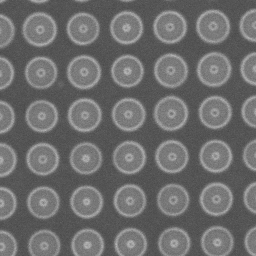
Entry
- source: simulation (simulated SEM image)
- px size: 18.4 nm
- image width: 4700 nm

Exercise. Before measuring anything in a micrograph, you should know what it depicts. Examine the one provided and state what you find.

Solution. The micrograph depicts an array of small figures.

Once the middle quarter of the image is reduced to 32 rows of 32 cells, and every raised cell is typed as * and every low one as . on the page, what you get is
**......*****......****.......**
*...**...***...*....***...*....*
*....*...***.......****.......**
**......*****......****.......**
**......******....******.....***
***...********************.*****
********************************
********************************
**************************.*****
****...*******....******.....***
**......*****......*****......**
**.......****.......***........*
**...*...***...**...***...**...*
**...*...****.......***.......**
**.......****......*****......**
***.....******....*******....***
****..**************************
********************************
********************************
**************************.*****
****...*******.....*****.....***
***.....*****......*****......**
**.......****.......***........*
**...*...****...*...***...**...*
**.......****.......****......**
**.......****......*****......**
***.....******....********...***
********************************
********************************
********************************
****************.*********..****
****....******.....******.....**